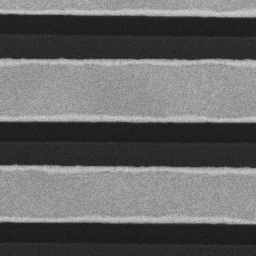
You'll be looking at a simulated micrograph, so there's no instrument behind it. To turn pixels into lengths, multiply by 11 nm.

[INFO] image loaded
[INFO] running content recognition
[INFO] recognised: lines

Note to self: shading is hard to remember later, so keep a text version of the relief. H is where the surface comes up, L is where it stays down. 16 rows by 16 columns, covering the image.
HHHHHHHHHHHHHHHH
LLLLLLLLLLLLLLLL
LLLLLLLLLLLLLLLL
LLLLLLLLLLLLLLLL
HHHHHHHHHHHHHHHH
HHHHHHHHHHHHHHHH
HHHHHHHHHHHHHHHH
HHHHHHHHHHHHHHHH
LLLLLLLLLLLLLLLL
LLLLLLLLLLLLLLLL
HHHHHHHHHHHHLHHH
HHHHHHHHHHHHHHHH
HHHHHHHHHHHHHHHH
HHHHHHHHHHHHHHHH
LLLLLLLLLLLLLLLL
LLLLLLLLLLLLLLLL